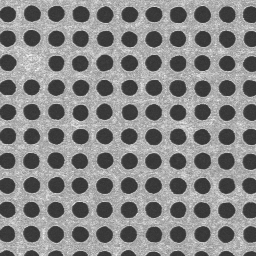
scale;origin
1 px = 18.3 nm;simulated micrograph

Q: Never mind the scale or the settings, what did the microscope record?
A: a regular array of holes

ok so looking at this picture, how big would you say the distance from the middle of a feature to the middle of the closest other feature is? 438 nanometers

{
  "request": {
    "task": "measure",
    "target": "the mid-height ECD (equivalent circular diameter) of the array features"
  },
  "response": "0.295 um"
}